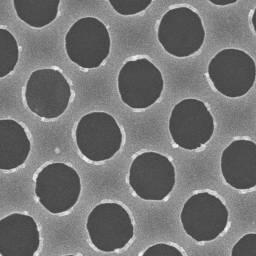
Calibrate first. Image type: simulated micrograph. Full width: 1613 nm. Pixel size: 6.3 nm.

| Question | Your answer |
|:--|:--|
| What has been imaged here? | a regular array of holes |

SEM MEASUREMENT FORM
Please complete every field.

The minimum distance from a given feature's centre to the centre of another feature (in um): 0.41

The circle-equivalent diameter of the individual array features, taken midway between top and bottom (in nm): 300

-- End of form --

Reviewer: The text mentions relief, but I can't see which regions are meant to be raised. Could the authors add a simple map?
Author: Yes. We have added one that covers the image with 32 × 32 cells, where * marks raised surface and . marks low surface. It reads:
**.....*******.....********..***
**.....********..****...********
***....***..********.....******.
*********....*******.....*******
..******......******......******
..******......******.....*******
..******......*******...***...**
..*******....****.********......
..*************.....******......
.***....*******.....******......
***......******.....*******.....
***......******.....*******....*
***......******.....***..*******
****....*********.****....******
*****..***....*******.....******
..********.....******......*****
...*******.....******......*****
....******.....*******....****.*
....******.....********..***....
...********...***...********....
...***..********.....*******....
*****.....******......******....
*****.....******......******....
****......*******.....*******..*
*****.....*******....***...*****
*****....****..********.....****
******..***.....*******.....****
....*******.....*******.....****
.....******......******.....****
.....******......*******...***..
.....*******....****.********...
....**************.....******...